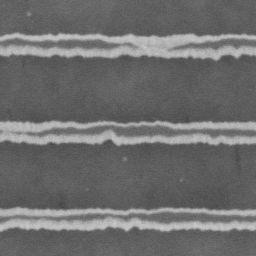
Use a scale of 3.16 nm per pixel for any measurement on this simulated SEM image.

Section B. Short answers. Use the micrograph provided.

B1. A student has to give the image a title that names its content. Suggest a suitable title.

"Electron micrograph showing lines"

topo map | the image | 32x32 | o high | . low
................................
................................
................................
................................
.oo....ooo.oo...............ooo.
oooooooooooooooooooooooooooooooo
oooooooooooooooooooooooooooooooo
................................
................................
................................
................................
................................
................................
................................
................................
......ooo..oooo.ooooo....o......
oooooooooooooooooooooooooooooooo
..ooooooooooo.oooooooooooooooooo
................................
................................
................................
................................
................................
................................
................................
................................
oooooooooooooooooooooooooooooooo
oooooooooooooooooooooooooooooooo
o.........o.........oo...oooo..o
................................
................................
................................